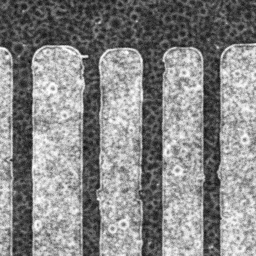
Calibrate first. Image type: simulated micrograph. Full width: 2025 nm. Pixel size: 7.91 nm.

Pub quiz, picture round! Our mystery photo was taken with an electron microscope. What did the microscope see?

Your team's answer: one or a few lines or trenches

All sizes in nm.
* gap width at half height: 151